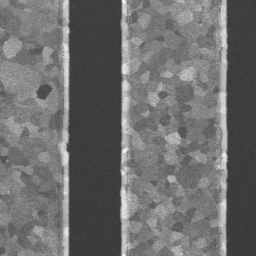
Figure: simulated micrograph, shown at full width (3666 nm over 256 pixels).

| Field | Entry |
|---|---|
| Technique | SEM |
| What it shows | one or a few lines or trenches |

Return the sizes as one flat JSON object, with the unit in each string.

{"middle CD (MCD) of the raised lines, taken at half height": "99.5 pixels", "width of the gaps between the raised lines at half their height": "0.831 um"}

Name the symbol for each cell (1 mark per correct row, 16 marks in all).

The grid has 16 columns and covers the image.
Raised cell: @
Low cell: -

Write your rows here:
@@@@----@@@@@@--
@@@@----@@@@@@--
@@@@----@@@@@@--
@@@@----@@@@@@--
@@@@----@@@@@@--
@@@@----@@@@@@--
@@@@----@@@@@@--
@@@@----@@@@@@--
@@@@----@@@@@@--
@@@@----@@@@@@--
@@@@----@@@@@@--
@@@@----@@@@@@--
@@@@----@@@@@@--
@@@@----@@@@@@--
@@@@----@@@@@@--
@@@@----@@@@@@--